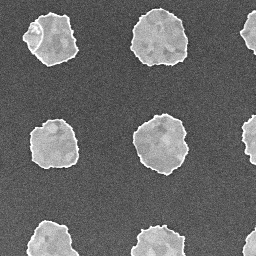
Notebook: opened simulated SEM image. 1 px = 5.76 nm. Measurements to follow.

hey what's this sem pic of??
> raised bodies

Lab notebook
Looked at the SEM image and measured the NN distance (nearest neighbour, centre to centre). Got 607 nm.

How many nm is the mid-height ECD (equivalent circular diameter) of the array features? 305